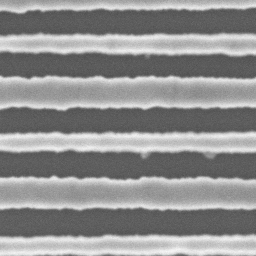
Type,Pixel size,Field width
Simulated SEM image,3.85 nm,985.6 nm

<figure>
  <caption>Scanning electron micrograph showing lines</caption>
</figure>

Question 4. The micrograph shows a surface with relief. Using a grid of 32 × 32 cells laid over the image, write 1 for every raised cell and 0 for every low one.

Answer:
11111111111111111111111111111111
00100000000000000000000000000000
00000000000000000000000000000000
00000000000000000000000000000000
01111111111111111111111111111111
11111111111111111111111111111111
00011011111011111111111111111111
00000000000000000000000000000000
00000000000000000000000000000000
00000000000000000000000000000000
11111111111111111111111111111111
11111111111111111111111111111111
11111111111111111111111111111111
10001111100011101110001101001000
00000000000000000000000000000000
00000000000000000000000000000000
00000000000000000000000000000000
11111111111111111111111111111111
11111111111111111111111111111111
00000000000000000000000000000000
00000000000000000000000000000000
00000000000000000000000000000000
11111111111111001111111111111100
11111111111111111111111111111111
11111111111111111111111111111111
11111111111111111111111111111111
00000000000000000000000000000000
00000000000000000000000000000000
00000000000000000000000000000000
00000000000000000000000000000000
11111111111111111111111111111111
11111111111111111111111111111111